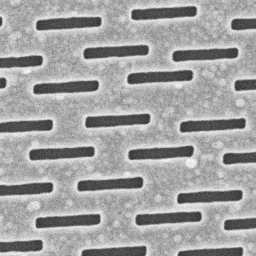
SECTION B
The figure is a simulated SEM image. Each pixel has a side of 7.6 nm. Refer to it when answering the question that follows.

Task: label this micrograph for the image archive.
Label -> a regular array of holes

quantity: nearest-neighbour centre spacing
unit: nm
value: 413